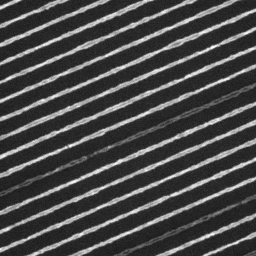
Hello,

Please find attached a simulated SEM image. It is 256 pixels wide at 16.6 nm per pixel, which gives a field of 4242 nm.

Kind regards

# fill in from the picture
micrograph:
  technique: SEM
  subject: parallel lines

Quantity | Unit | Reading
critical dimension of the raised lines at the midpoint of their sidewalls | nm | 41.9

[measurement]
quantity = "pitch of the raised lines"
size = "284 nanometres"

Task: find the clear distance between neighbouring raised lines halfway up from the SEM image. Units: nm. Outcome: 244